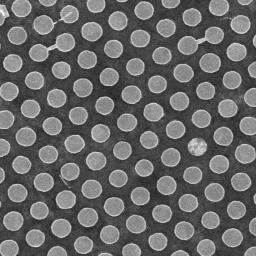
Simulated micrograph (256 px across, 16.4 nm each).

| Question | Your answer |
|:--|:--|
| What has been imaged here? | a regular array of raised bodies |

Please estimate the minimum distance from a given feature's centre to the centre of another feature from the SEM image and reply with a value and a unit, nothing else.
458 nm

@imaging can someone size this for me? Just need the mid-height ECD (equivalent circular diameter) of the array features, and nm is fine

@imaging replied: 304